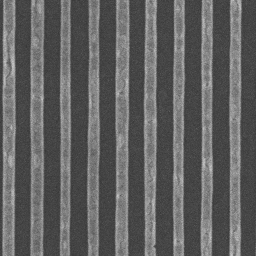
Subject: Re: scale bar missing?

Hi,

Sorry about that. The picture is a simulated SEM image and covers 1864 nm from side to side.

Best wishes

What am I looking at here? parallel lines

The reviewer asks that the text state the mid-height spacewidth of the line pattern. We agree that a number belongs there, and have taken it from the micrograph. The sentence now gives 131 nanometers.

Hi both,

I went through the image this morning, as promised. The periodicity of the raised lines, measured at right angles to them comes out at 206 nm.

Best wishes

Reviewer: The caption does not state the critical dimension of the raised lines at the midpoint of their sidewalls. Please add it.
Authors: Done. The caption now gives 9.88 px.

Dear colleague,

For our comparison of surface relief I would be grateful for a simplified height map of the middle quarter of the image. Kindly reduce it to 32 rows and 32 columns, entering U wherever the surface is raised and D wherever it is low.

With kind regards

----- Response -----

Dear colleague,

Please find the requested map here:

UDDDDDUUDDDDDUUUDDDDUUUDDDDDUUDD
UDDDDDUUDDDDDUUUDDDDUUUDDDDDUUDD
UDDDDDUUDDDDDUUUDDDDUUUDDDDDUUDD
UDDDDDUUDDDDDUUUDDDDUUUDDDDDUUDD
UDDDDDUUDDDDDUUUDDDDUUUDDDDDUUDD
UDDDDDUUDDDDDUUUDDDDUUUDDDDDUUDD
UDDDDDUUDDDDDUUUDDDDUUUDDDDDUUDD
UDDDDDUUDDDDDUUUDDDDUUUDDDDDUUDD
UDDDDDUUDDDDDUUUDDDDUUUDDDDDUUDD
UDDDDDUUDDDDDUUUDDDDUUUDDDDDUUDD
UDDDDDUUDDDDDUUUDDDDUUUDDDDUUUDD
UUDDDDUUDDDDDUUUDDDDUUUDDDDUUUDD
UUDDDDUUDDDDDUUUDDDDUUUDDDDUUUDD
UUDDDDUUUDDDDUUUDDDDUUUDDDDDUUDD
UUDDDDUUUDDDDUUUDDDDUUUDDDDDUUDD
UDDDDDUUUDDDDUUUDDDDUUUDDDDDUUDD
UDDDDDUUUDDDDUUUDDDDUUUDDDDDUUDD
UDDDDDUUUDDDDUUUDDDDUUUDDDDDUUDD
UDDDDDUUUDDDDUUUDDDDUUUDDDDDUUDD
UDDDDDUUUDDDDUUUDDDDUUUDDDDUUUDD
UDDDDDUUUDDDDUUUDDDDUUUDDDDUUUDD
UDDDDDUUUDDDDUUUDDDDUUUDDDDUUUDD
UDDDDDUUUDDDDUUUDDDDUUUDDDDDUUDD
UDDDDDUUUDDDDUUUDDDDUUUDDDDDUUDD
UDDDDDUUUDDDDUUUDDDDUUUDDDDDUUDD
UDDDDDUUDDDDDUUUDDDDUUUDDDDDUUDD
UDDDDDUUDDDDDUUUDDDDUUUDDDDDUUDD
UDDDDDUUDDDDDUUUDDDDUUUDDDDDUUDD
UDDDDDUUDDDDDUUUDDDDUUUDDDDDUUDD
UDDDDDUUDDDDDUUUDDDDUUUDDDDDUUDD
UDDDDDUUDDDDDUUUDDDDUUUDDDDDUUDD
UDDDDDUUDDDDDUUUDDDDUUUDDDDDUUDD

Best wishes